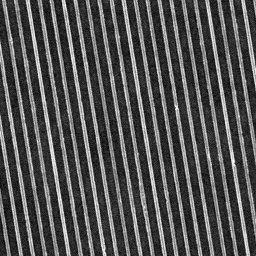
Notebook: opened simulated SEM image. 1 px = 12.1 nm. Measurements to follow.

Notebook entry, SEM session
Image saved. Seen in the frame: parallel lines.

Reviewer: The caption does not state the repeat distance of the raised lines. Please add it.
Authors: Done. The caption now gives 0.142 micrometres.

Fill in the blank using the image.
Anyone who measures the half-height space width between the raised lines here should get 109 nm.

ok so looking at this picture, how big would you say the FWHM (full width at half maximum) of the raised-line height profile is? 35.7 nm